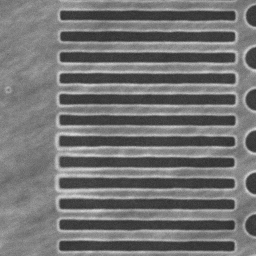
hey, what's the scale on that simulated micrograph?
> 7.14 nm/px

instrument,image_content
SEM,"groups of lines, slits or small figures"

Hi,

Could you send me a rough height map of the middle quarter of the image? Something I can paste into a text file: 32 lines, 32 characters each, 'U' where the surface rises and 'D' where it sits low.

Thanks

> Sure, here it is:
UUUUUUUUUUUUUUUUUUUUUUUUUUUUUUUU
UUUUUUUUUUUUUUUUUUUUUUUUUUUUUUUU
DDDDDDDDDDDDDDDDDDDDDDDDDDDDDDDD
DDDDDDDDDDDDDDDDDDDDDDDDDDDDDDDD
DDDDDDDDDDDDDDDDDDDDDDDDDDDDDDDD
UUUUUUUUUUUUUUUUUUUUUUUUUUUUUUUU
UUUUUUUUUUUUUUUUUUUUUUUUUUUUUUUU
DDDDDDDDDDDDDDUUUDDDDDDDDDDDDDDD
DDDDDDDDDDDDDDDDDDDDDDDDDDDDDDDD
DDDDDDDDDDDDDDDDDDDDDDDDDDDDDDDD
UUUUUUUUUUUUUUUUUUUUUUUUUUUUUUUU
UUUUUUUUUUUUUUUUUUUUUUUUUUUUUUUU
DDUUUUUUUUUUUUUUUUUUUUUUUUUUUUUU
DDDDDDDDDDDDDDDDDDDDDDDDDDDDDDDD
DDDDDDDDDDDDDDDDDDDDDDDDDDDDDDDD
DDDDDUUUUUUUUUUUUUUUUUDDDDDDDUUU
UUUUUUUUUUUUUUUUUUUUUUUUUUUUUUUU
UUUUUUUUUUUUUUUUUUUUUUUUUUUUUUUU
DDDDDDDDDDDDDDDDDDDDDDDDDDDDDDDD
DDDDDDDDDDDDDDDDDDDDDDDDDDDDDDDD
DDDDDDDDDDDDDDDDDDDDDDDDDDDDDDDD
UUUUUUUUUUUUUUUUUUUUUUUUUUUUUUUU
UUUUUUUUUUUUUUUUUUUUUUUUUUUUUUUU
DDDDDDDDDDDDDDDDDDDDDDDDDDDDDDDD
DDDDDDDDDDDDDDDDDDDDDDDDDDDDDDDD
DDDDDDDDDDDDDDDDDDDDDDDDDDDDDDDD
UUUUUUUUUUUUUUUUUUUUUUUUUUUUUUUU
UUUUUUUUUUUUUUUUUUUUUUUUUUUUUUUU
DDDDDDDDDDDDDDDDDDDDDDDDDDDDDDDD
DDDDDDDDDDDDDDDDDDDDDDDDDDDDDDDD
DDDDDDDDDDDDDDDDDDDDDDDDDDDDDDDD
DDDDDDDUUUUUUUUUUUUUUUUUUUUUUUUU